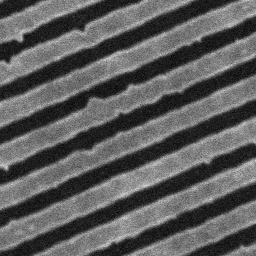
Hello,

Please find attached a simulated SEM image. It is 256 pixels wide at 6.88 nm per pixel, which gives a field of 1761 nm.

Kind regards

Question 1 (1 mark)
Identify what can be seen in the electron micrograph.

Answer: parallel lines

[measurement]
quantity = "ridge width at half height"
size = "143 nm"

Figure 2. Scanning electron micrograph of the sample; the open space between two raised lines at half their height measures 125 nm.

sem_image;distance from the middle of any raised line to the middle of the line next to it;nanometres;262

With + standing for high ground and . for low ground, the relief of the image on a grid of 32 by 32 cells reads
.....++++++......++++++......+++
...++++++.....+++++++.....++++++
++++++......++++++......++++++..
++++.......+++++......++++++....
+++.....++++++......++++++.....+
.....+++++++......++++++.....+++
...++++++......++++++......+++++
.++++++.....+++++++......++++++.
+++++......++++++.....++++++....
+++.....++++++......++++++......
......++++++......++++++......++
....++++++.....+++++++.....+++++
.+++++++...+++++++++.....++++++.
+++++......++++++......++++++...
+++......++++++......+++++......
+......++++++.....++++++......++
....++++++......++++++......++++
..++++++.....+++++++.....+++++++
++++++......++++++.....+++++++..
++++.....++++++......++++++.....
+......++++++......++++++.....++
....++++++......++++++......++++
..++++++......++++++......++++++
++++++......++++++......++++++..
++++.....+++++++.....+++++++....
++.....++++++......++++++......+
.....++++++......++++++......+++
..+++++++.....+++++++.....++++++
+++++++.....++++++.......+++++..
++++......+++++++.....++++++....
++.....+++++++.....+++++++......
.....++++++......+++++++.....+++